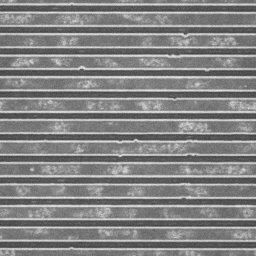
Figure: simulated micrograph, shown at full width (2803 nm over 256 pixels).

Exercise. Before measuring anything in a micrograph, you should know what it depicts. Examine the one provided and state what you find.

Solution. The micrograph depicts parallel lines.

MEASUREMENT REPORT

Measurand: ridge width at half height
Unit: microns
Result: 0.153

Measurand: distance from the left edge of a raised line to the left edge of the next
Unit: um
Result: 0.235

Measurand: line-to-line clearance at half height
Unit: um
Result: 0.0821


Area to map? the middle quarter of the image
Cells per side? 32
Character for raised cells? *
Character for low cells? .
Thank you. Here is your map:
********************************
................................
................................
********************************
********************************
********************************
********************************
................................
................................
********************************
********************************
********************************
................................
................................
********************************
********************************
********************************
................................
................................
********************************
********************************
********************************
*******************************.
................................
................................
********************************
********************************
********************************
................................
................................
********************************
********************************